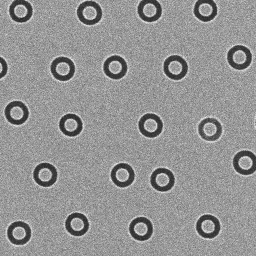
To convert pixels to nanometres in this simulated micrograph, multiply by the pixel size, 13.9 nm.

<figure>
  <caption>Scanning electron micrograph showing a regular array of ring-shaped grooves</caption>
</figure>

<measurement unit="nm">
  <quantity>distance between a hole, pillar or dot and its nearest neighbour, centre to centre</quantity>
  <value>774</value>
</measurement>